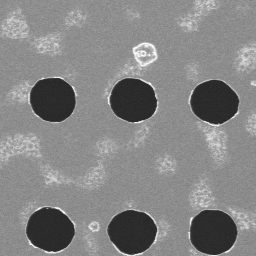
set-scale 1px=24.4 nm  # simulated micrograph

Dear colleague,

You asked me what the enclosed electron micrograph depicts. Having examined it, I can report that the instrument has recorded holes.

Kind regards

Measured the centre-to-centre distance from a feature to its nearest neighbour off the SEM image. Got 1970 nanometers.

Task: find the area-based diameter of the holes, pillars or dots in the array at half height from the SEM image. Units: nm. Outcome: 1120